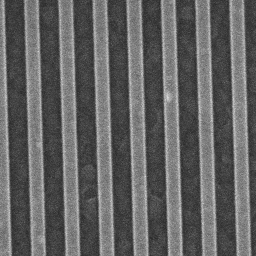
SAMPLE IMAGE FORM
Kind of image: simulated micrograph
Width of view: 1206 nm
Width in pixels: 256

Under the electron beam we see parallel lines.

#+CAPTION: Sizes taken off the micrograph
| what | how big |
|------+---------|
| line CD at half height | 63.5 nanometers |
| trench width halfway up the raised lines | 0.0988 micrometres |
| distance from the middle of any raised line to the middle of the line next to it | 0.161 um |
